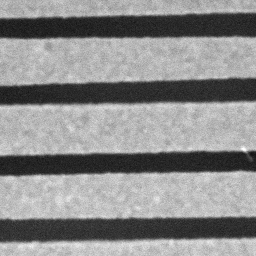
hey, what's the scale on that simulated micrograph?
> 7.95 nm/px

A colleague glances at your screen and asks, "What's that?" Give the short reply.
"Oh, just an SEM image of lines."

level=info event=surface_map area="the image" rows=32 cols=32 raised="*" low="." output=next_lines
********************************
********************************
................................
................................
................................
********************************
********************************
********************************
********************************
********************************
*****...........................
................................
................................
********************************
********************************
********************************
********************************
********************************
********************************
................................
................................
.............................**.
********************************
********************************
********************************
********************************
********************************
................................
................................
................................
********************************
********************************